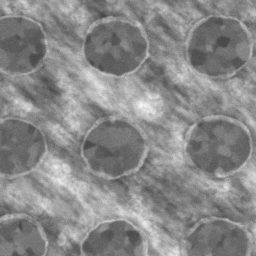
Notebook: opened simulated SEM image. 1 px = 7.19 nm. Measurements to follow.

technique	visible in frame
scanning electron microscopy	raised bodies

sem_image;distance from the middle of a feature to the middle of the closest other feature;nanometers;723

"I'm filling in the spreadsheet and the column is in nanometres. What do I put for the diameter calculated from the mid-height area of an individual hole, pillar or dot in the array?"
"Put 464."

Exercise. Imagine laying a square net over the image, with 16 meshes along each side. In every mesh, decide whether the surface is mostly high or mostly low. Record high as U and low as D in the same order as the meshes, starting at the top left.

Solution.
DDDDDDDDDDDDDDDD
UUDDDDUUUDDDUUUD
UUUDDUUUUDDDUUUU
UUUDDUUUUDDDUUUU
UUDDDDUUDDDDUUUD
DDDDDDDDDDDDDDDD
DDDDDDDDDDDDDDDD
UDDDDDUUDDDDDUUD
UUUDDUUUUDDDUUUU
UUUDDUUUUDDDUUUU
UUDDDDUUUDDDUUUD
DDDDDDDDDDDDDDDD
DDDDDDDDDDDDDDDD
UUDDDDDDDDDDDDDD
UUUDDDUUUDDDUUUD
UUUDDUUUUDDUUUUU